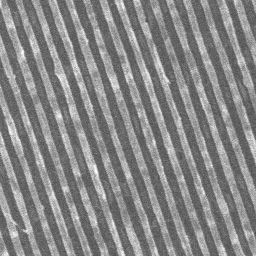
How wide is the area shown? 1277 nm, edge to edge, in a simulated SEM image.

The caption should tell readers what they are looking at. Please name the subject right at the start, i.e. parallel lines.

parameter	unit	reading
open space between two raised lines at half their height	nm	48.4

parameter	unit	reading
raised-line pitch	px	15.9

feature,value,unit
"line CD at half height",34.2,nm